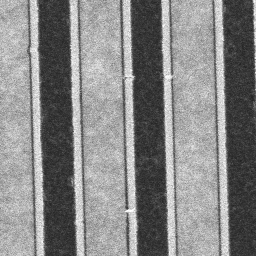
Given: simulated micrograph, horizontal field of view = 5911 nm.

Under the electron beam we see one or a few lines or trenches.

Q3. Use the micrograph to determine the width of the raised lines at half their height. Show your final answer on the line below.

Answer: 932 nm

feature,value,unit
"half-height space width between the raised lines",1200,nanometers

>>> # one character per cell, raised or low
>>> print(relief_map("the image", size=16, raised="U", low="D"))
DDUUUDDDUUDDDDUU
DDUUUDDDUUDDDDUU
DDUUUDDDUUDDDDUU
DDUUUDDDUUDDDDUU
DDUUUDDDUUDDDDUU
DDUUUDDDUUDDDDUU
DDUUUDDDUUDDDDUU
DDUUUDDDUUDDDDUU
DDUUUDDDUUUDDDUU
DDUUUDDDUUUDDDUU
DDUUUDDDUUUDDDUU
DDUUUDDDUUUDDDUU
DDUUUDDDUUUDDDUU
DDUUUDDDUUUDDDUU
DDDUUDDDUUUDDDUU
DDDUUDDDUUUDDDUU